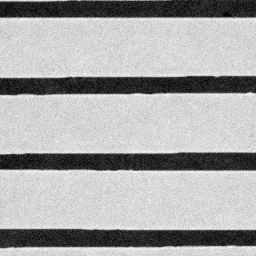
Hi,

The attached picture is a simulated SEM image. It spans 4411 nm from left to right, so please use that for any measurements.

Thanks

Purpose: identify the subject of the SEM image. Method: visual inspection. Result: lines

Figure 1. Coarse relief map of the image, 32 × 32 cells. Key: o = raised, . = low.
................................
................................
oooooooooooooooooooooooooooooooo
oooooooooooooooooooooooooooooooo
oooooooooooooooooooooooooooooooo
oooooooooooooooooooooooooooooooo
oooooooooooooooooooooooooooooooo
oooooooooooooooooooooooooooooooo
oooooooooooooooooooooooooooooooo
oooooooooooooooooooooooo..oo....
................................
................................
oooooooooooooooooooooooooooooooo
oooooooooooooooooooooooooooooooo
oooooooooooooooooooooooooooooooo
oooooooooooooooooooooooooooooooo
oooooooooooooooooooooooooooooooo
oooooooooooooooooooooooooooooooo
oooooooooooooooooooooooooooooooo
................................
................................
oooooooooooooooooooooooooooooooo
oooooooooooooooooooooooooooooooo
oooooooooooooooooooooooooooooooo
oooooooooooooooooooooooooooooooo
oooooooooooooooooooooooooooooooo
oooooooooooooooooooooooooooooooo
oooooooooooooooooooooooooooooooo
oooooooooooooooooooooooooooooooo
................................
................................
oooooooooooooooooooooooooooooooo